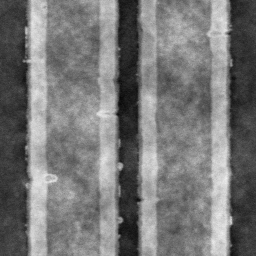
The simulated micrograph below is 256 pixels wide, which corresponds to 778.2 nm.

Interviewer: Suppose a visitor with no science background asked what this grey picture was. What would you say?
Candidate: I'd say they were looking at one or a few lines or trenches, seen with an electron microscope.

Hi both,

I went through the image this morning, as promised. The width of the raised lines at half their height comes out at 221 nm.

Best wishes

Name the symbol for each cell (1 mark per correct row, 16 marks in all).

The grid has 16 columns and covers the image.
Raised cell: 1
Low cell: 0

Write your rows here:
0011111001111100
0011111001111100
0011111001111100
0011111001111100
0011111001111100
0011111001111100
0011111001111100
0011111001111100
0011111001111100
0011111001111100
0011111001111100
0011111001111100
0011111001111100
0011111001111100
0011111001111100
0011111001111100